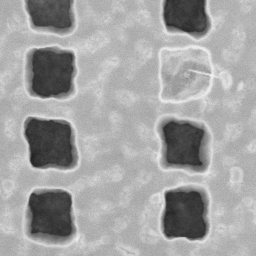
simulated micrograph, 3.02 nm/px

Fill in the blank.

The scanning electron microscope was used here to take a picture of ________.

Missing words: holes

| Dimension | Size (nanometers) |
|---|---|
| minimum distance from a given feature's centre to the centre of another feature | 214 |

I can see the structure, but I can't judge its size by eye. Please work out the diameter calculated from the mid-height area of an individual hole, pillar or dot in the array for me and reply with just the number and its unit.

156 nanometers